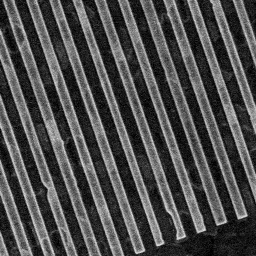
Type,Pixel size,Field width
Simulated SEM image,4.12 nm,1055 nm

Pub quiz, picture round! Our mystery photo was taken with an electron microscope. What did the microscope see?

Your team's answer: parallel lines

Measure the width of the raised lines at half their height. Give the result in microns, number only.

0.0395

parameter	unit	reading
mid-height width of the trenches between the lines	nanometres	47.8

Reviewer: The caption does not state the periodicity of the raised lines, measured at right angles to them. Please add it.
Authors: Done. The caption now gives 89.2 nm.